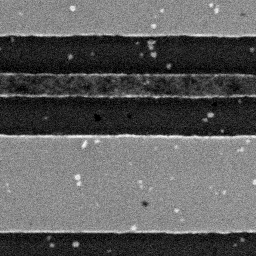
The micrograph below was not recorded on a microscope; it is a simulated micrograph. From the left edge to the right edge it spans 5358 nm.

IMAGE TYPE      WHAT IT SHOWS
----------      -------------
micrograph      lines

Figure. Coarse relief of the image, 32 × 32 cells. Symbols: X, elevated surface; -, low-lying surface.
XXXXXXXXXXXXXXXXXXXXXXXXXXXXXXXX
XXXXXXXXXXXXXXXXXXXXXXXXXXXXXXXX
XXXXXXXXXXXXXXXXXXXXXXXXXXXXXXXX
XXXXXXXXXXXXXXXXXXXXXXXXXXXXXXXX
---------------------------XXXX-
--------------------------------
--------------------------------
--------------------------------
--------------------------------
XXXXXXXXXXXXXXXXXXXXXXXXXXXXXXXX
XXXXXXXXXXXXXXXXXXXXXXXXXXXXXXXX
XXXXXXXXXXXXXXXXXXXXXXXXXXXXXXXX
--------------------------------
--------------------------------
--------------------------------
--------------------------------
--------------------------------
XXXXXXXXXXXXXXXXXXXXXXXXXXXXXXXX
XXXXXXXXXXXXXXXXXXXXXXXXXXXXXXXX
XXXXXXXXXXXXXXXXXXXXXXXXXXXXXXXX
XXXXXXXXXXXXXXXXXXXXXXXXXXXXXXXX
XXXXXXXXXXXXXXXXXXXXXXXXXXXXXXXX
XXXXXXXXXXXXXXXXXXXXXXXXXXXXXXXX
XXXXXXXXXXXXXXXXXXXXXXXXXXXXXXXX
XXXXXXXXXXXXXXXXXXXXXXXXXXXXXXXX
XXXXXXXXXXXXXXXXXXXXXXXXXXXXXXXX
XXXXXXXXXXXXXXXXXXXXXXXXXXXXXXXX
XXXXXXXXXXXXXXXXXXXXXXXXXXXXXXXX
XXXXXXXXXXXXXXXXXXXXXXXXXXXXXXXX
--------------------------------
--------------------------------
--------------------------------